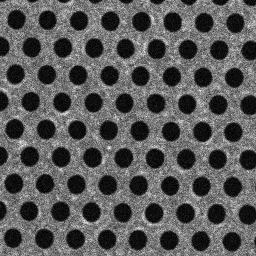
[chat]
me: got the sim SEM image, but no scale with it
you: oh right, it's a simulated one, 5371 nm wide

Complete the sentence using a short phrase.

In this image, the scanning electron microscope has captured a regular array of holes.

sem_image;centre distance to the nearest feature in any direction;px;31.1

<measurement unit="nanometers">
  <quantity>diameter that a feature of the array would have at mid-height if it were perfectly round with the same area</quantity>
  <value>413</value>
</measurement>